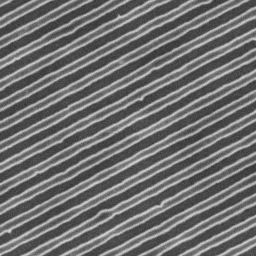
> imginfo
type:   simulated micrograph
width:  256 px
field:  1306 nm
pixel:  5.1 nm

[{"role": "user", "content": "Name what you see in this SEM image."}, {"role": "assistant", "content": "parallel lines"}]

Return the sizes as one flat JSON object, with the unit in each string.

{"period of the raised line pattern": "18.4 pixels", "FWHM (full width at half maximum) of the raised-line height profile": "43.4 nanometers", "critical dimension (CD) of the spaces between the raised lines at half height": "51.8 nm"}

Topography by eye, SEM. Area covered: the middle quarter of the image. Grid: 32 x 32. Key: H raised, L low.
LHHHHLLLLLLHHHHLLLLLHHHHLLLLLLHH
HHHLLLLLLHHHHLLLLLHHHHLLLLLLLHHH
HLLLLLLHHHHLLLLLLHHHHLLLLLHHHHHL
LLLLLHHHHLLLLLLHHHHLLLLLHHHHHLLL
LLLHHHHLLLLLLHHHHLLLLLHHHHHLLLLL
LHHHHLLLLLLHHHHLLLLLLHHHHLLLLLLH
HHHHLLLLLHHHHLLLLLHHHHHLLLLLLHHH
HLLLLLLHHHHLLLLLLHHHHLLLLLLHHHHL
LLLLLHHHHHLLLLLHHHHHLLLLLHHHHLLL
LLLLHHHHLLLLLLHHHLLLLLLHHHHLLLLL
LHHHHHLLLLLHHHHHLLLLLHHHHLLLLLLH
HHHHLLLLLHHHHHLLLLLHHHHHLLLLLHHH
HHLLLLLHHHHHLLLLLHHHHLLLLLLHHHHL
LLLLLLHHHHLLLLLLHHHLLLLLLHHHHLLL
LLLHHHHLLLLLLLHHHLLLLLLLHHHLLLLL
LLHHHHLLLLLLHHHHLLLLLLHHHHLLLLLH
HHHHLLLLLLHHHHLLLLLLHHHHLLLLLHHH
HHLLLLLLHHHHLLLLLLHHHHLLLLLHHHHH
LLLLLLHHHHHLLLLLHHHHLLLLLLHHHHLL
LLLLHHHHLLLLLLHHHHLLLLLLHHHHLLLL
LLHHHHHLLLLLHHHHLLLLLLHHHHLLLLLH
HHHHLLLLLLHHHHHLLLLLHHHHLLLLLHHH
HHHLLLLLHHHHLLLLLLHHHHLLLLLLHHHH
HLLLLLHHHHHLLLLLLHHHLLLLLLHHHHLL
LLLLHHHHHLLLLLLHHHLLLLLLHHHHLLLL
LLLHHHHLLLLLHHHHLLLLLLHHHHHLLLLL
LHHHHLLLLLHHHHHLLLLLHHHHLLLLLLHH
HHHLLLLLHHHHHLLLLLLHHHLLLLLLHHHH
HHLLLLLHHHHLLLLLLHHHHLLLLLHHHHHL
LLLLLHHHHLLLLLLHHHHLLLLLHHHHHLLL
LLLHHHHLLLLLLHHHHLLLLLLHHHLLLLLL
LHHHHLLLLLLHHHHLLLLLLHHHHLLLLLHH